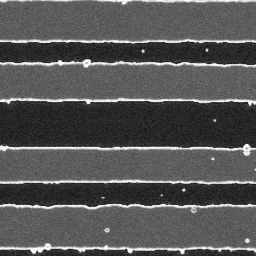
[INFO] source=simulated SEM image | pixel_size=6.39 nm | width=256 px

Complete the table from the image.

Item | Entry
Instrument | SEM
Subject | lines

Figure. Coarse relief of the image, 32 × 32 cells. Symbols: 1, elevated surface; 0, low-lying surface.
11111111111111111111111111111111
11111111111111111111111111111111
11111111111111111111111111111111
11111111111111111111111111111111
11111111111111111111111111111111
00000000000000000000000000000000
00000000000000000000000000000000
00000000000000000000000000000000
11111111111111111111111111111111
11111111111111111111111111111111
11111111111111111111111111111111
11111111111111111111111111111111
11111111111111111111111111111111
00000000000000000000000000000000
00000000000000000000000000000000
00000000000000000000000000000000
00000000000000000000000000000000
00000000000000000000000000000000
11111111111110111111110111000011
11111111111111111111111111111111
11111111111111111111111111111111
11111111111111111111111111111111
11111111111111111111111111111111
00000000000000000000000000000000
00000000000000000000000000000000
00000000000000000000000000000000
11111111111111111111111111111111
11111111111111111111111111111111
11111111111111111111111111111111
11111111111111111111111111111111
11111111111111111111111111111111
00000000000000000000000000000000